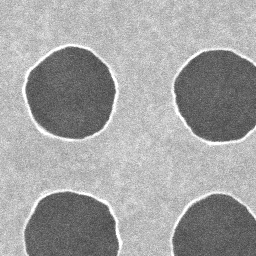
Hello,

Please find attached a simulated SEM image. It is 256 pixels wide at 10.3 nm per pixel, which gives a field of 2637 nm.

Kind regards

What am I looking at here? holes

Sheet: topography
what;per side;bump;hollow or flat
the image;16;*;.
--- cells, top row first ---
****************
****************
****************
***...******...*
**.....****.....
**.....****.....
**.....****.....
**.....****.....
****..******...*
****************
****************
****************
***...******...*
**.....****.....
**.....****.....
**.....****.....